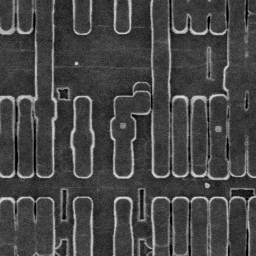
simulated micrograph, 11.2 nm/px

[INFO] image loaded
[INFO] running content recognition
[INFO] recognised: wiring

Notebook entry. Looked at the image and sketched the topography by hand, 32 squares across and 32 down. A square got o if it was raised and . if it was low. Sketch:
ooooooo..oo...oo...ooooooooooooo
ooooooo..oo...oo...ooooooooooooo
ooooooo..oo...oo...ooooooooooooo
ooooooo..oo...oo...ooooooooooooo
....ooo............oo.......oooo
....ooo............oo.......oooo
.....oo............oo.......oooo
.....oo............oo.......oooo
.....oo............oo.......oooo
.....oo............oo.......oooo
.....oo............oo.......oooo
.....oo..........o.oo.......oooo
ooooooo..oo...ooooooooo.oooooooo
ooooooo..oo...ooooooooo.oooooooo
ooooooo..oo...ooo..ooooooooooooo
ooooooo..oo...ooo..ooooooooooooo
ooooooo..ooo..ooo..ooooooooooooo
ooooooo..ooo..ooo..ooooooooooooo
ooooooo..ooo..ooo..ooooooooooooo
ooooooo..oo...ooo..ooooooooooooo
ooooooo..oo...ooo..ooooooooooooo
ooooooo..ooo..ooo..oooo.oooooooo
................................
................................
................................
ooooooo..ooo..oo...ooooooooo...o
ooooooo..ooo..oo...ooooooooo...o
ooooooo..oo...oo...ooooooooo...o
ooooooo..oo...oo...ooooooooo...o
ooooooo..oo...ooo..oo.oooooo...o
ooooooo..oo...ooo..oo.oooooo...o
ooooooo..oo...ooo..ooooooooo...o